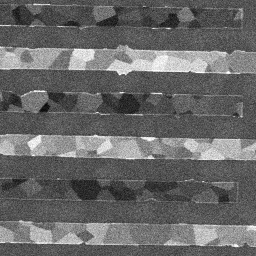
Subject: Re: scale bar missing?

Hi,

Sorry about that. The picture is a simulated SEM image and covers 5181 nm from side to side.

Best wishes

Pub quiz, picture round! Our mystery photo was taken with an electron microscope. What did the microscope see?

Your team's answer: parallel lines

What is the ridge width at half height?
417 nm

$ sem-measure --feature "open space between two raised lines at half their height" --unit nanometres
460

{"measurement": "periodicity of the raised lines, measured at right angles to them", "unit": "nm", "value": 879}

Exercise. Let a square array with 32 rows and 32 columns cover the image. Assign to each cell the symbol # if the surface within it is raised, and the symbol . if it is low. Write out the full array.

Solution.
................................
##############################..
##############################..
.....................##....#.#..
................................
................................
########################..##.##.
################################
##.#############################
................................
................................
#...##..........................
##############################..
##############################..
......................#......#..
................................
................................
################################
################################
........########################
................................
................................
############....................
##############################..
##############################..
................................
................................
................................
################################
################################
...........#...####.############
................................